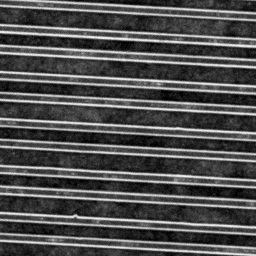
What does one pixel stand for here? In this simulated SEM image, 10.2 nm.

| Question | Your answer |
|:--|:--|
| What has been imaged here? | parallel lines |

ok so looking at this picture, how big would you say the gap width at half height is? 157 nm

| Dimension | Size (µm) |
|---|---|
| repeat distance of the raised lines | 0.238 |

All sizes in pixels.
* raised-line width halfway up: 7.24